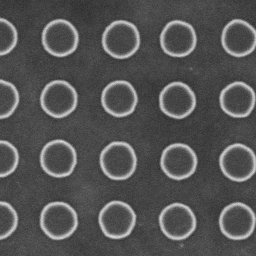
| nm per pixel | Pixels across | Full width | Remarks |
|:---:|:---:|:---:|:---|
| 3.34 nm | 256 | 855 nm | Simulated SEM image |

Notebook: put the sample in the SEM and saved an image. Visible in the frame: a regular array of raised bodies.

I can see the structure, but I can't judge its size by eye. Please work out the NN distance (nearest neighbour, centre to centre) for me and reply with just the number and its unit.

196 nanometres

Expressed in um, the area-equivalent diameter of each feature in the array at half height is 0.117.